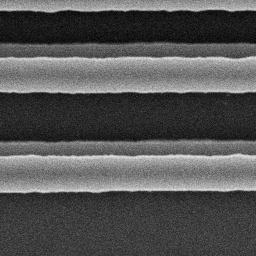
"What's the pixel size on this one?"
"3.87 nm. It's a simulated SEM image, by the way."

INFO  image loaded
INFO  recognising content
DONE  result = lines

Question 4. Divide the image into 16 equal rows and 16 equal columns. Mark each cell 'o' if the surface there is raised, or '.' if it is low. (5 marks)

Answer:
oooooooooooooooo
................
................
oooooooooooooooo
oooooooooooooooo
oooooooooooooooo
................
................
................
oooooooooooooooo
oooooooooooooooo
oooooooooooooooo
................
................
................
................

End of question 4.